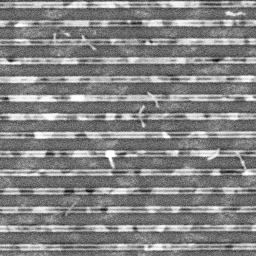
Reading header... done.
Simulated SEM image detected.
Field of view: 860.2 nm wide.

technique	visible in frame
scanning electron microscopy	parallel lines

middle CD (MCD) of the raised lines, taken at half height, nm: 14.3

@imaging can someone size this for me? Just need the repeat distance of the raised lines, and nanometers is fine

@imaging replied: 62.7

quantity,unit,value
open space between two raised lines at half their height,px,14.4